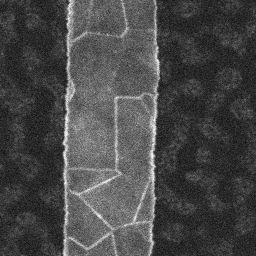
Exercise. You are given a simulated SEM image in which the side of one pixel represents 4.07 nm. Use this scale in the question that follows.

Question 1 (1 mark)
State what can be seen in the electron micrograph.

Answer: one or a few lines or trenches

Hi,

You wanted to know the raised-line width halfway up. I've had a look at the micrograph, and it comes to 358 nanometres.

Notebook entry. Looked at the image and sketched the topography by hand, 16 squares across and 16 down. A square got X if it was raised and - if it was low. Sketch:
----XXXXXX------
----XXXXXX------
----XXXXXX------
----XXXXXX------
----XXXXXX------
----XXXXXX------
----XXXXXX------
----XXXXXX------
----XXXXXX------
----XXXXXX------
----XXXXXX------
----XXXXXX------
----XXXXXX------
----XXXXXX------
----XXXXX-------
----XXXXX-------